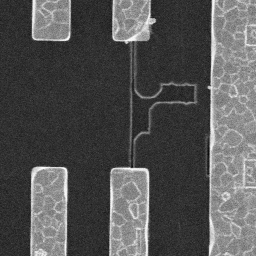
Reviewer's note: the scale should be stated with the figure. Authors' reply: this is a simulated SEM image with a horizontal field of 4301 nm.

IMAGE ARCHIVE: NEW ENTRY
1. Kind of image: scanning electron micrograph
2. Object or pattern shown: wiring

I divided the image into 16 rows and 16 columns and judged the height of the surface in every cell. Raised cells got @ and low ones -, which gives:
--@@---@@----@@@
--@@---@@----@@@
-------@-----@@-
-------------@@@
-------------@@@
-------------@@@
-------------@@@
-------------@@@
-------------@@@
-------------@@@
---@---------@@-
--@@---@@----@@@
--@@---@@----@@@
--@@---@@----@@@
--@@---@@----@@@
--@@---@@----@@@